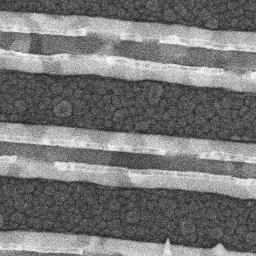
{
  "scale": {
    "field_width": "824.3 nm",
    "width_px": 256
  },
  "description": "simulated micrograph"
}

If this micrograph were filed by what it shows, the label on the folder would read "one or a few lines or trenches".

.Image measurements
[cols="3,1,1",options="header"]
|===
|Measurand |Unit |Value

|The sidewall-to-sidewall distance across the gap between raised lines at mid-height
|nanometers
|227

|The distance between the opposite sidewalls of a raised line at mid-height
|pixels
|37.8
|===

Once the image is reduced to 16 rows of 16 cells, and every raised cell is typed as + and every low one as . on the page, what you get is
................
+++.............
+++++++++++++...
++++++++++++++++
..........++++++
................
................
................
++++............
+++++++++++++++.
..++++++++++++++
..............++
................
................
................
+++++++.........